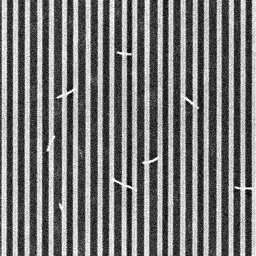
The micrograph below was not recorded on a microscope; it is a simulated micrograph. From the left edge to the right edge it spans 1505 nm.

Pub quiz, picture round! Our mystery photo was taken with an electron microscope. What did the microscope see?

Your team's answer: parallel lines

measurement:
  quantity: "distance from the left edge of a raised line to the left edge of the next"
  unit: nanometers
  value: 70.2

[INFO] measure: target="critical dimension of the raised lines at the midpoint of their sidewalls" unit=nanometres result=25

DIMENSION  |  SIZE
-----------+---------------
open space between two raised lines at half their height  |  44.9 nanometers